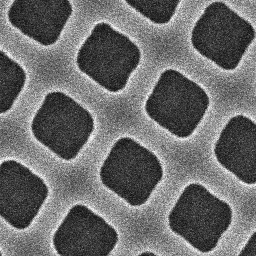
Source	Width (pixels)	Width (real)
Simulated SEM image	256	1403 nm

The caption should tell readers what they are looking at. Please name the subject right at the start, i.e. holes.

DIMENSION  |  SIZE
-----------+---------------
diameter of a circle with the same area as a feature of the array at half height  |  337 nanometers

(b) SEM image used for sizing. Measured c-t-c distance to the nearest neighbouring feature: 449 nanometres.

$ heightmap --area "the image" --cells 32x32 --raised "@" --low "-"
@--------@@@@@@@------@@@@--@@@@
@--------@@@@@@@@-----@@@----@@@
@-------@@@@@@@@@@@--@@@@------@
@@------@@@@--@@@@@@@@@@--------
@@@----@@@@-----@@@@@@@@--------
@@@@@--@@@-------@@@@@@@-------@
@@@@@@@@@@-------@@@@@@@@------@
--@@@@@@@@--------@@@@@@@@----@@
---@@@@@@@-------@@@@@@@@@@@-@@@
---@@@@@@@@-----@@@@---@@@@@@@@@
---@@@@@@@@@----@@@------@@@@@@@
---@@@--@@@@@@-@@@@-------@@@@@@
--@@@----@@@@@@@@@--------@@@@@@
-@@@@------@@@@@@@--------@@@@@@
@@@@-------@@@@@@@@-------@@@--@
@@@@--------@@@@@@@@-----@@@----
@@@@--------@@@@@@@@@---@@@@----
@@@@@------@@@@--@@@@@@@@@@-----
@@@@@@----@@@@----@@@@@@@@@-----
@@@@@@@---@@@------@@@@@@@@-----
---@@@@@@@@@@-------@@@@@@@@----
----@@@@@@@@--------@@@@@@@@@---
-----@@@@@@@@-------@@@@@@@@@@--
------@@@@@@@------@@@@---@@@@@@
------@@@@@@@@@----@@@-----@@@@@
-----@@@@@@@@@@@--@@@@------@@@@
-----@@@----@@@@@@@@@--------@@@
@---@@@@-----@@@@@@@@--------@@@
@@-@@@@-------@@@@@@@--------@@@
@@@@@@@--------@@@@@@@------@@@-
@@@@@@@--------@@@@@@@@@---@@@@-
@@@@@@@-------@@@@-@@@@@@-@@@@--